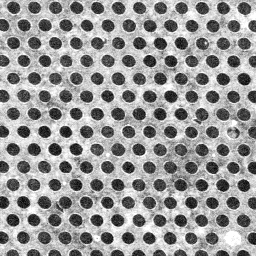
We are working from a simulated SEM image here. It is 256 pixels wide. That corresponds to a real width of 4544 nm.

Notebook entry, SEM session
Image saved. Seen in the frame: a regular array of raised bodies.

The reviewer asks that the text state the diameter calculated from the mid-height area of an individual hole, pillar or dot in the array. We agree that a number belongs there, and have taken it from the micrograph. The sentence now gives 249 nanometres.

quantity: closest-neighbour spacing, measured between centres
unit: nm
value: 362